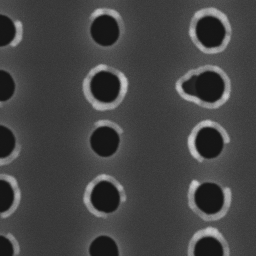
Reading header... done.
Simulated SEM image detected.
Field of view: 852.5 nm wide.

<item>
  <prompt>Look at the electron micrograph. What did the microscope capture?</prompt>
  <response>a regular array of holes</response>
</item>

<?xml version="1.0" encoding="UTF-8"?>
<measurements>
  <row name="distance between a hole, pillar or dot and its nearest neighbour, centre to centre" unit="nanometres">184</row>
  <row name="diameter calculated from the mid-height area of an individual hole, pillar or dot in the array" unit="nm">100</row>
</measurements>